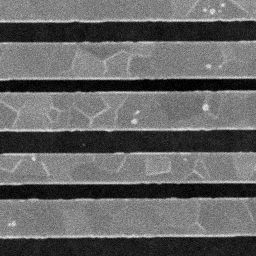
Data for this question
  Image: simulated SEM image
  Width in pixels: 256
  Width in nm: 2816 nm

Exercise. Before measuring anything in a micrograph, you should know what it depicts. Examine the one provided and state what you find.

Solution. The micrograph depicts lines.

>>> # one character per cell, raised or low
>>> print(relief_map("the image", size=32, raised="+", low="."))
++++++++++++++++++++++++++++++++
++++++++++++++++++++++++++++++++
++++++++++++++++++++++++++++++..
................................
................................
++++++++++++++++++++++++++++++++
++++++++++++++++++++++++++++++++
++++++++++++++++++++++++++++++++
++++++++++++++++++++++++++++++++
++++++++++++++++++++++++++++++++
................................
........................++++++++
++++++++++++++++++++++++++++++++
++++++++++++++++++++++++++++++++
++++++++++++++++++++++++++++++++
++++++++++++++++++++++++++++++++
................................
................................
................................
++++++++++++++++++++++++++++++++
++++++++++++++++++++++++++++++++
++++++++++++++++++++++++++++++++
++++++++++++++++++++++++++++++++
................................
................................
++++++++++++++++++++++++++++++++
++++++++++++++++++++++++++++++++
++++++++++++++++++++++++++++++++
++++++++++++++++++++++++++++++++
++++++++++++++++++++++++++++++..
................................
................................